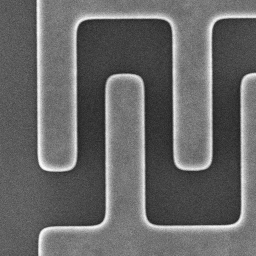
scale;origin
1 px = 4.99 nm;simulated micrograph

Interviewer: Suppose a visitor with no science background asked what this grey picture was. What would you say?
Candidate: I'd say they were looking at groups of lines, slits or small figures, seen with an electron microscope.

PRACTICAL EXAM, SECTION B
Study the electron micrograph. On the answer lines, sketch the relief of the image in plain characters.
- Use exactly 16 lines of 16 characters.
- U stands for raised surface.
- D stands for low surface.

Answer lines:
DDUUUUUUUUUUUUUU
DDUUUDDDDDDUUDDD
DDUUUDDDDDDUUDDD
DDUUUDDDDDDUUDDD
DDUUUDDDDDDUUDDD
DDUUUDDUUDDUUDDU
DDUUUDDUUDDUUDDU
DDUUUDDUUDDUUDDU
DDUUUDDUUDDUUDDU
DDUUUDDUUDDUUDDU
DDDUDDDUUDDUUDDU
DDDDDDDUUDDDDDDU
DDDDDDDUUDDDDDDU
DDDDDDDUUDDDDDDU
DDDUUUUUUUUUUUUU
DDUUUUUUUUUUUUUU